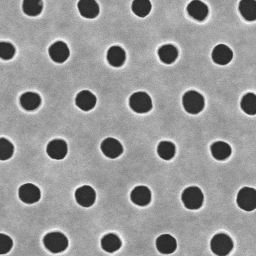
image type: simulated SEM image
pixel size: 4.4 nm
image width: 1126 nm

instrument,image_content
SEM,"a regular array of holes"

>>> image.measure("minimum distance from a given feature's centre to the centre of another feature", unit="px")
53.2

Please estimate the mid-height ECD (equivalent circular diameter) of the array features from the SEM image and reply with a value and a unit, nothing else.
96.1 nm